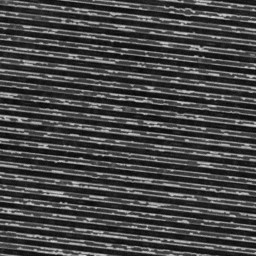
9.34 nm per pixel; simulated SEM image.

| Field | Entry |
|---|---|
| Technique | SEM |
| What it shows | parallel lines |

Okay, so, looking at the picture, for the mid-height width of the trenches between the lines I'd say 0.0545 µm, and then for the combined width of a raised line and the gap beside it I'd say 11.5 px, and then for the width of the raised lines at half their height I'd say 54.5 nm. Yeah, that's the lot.